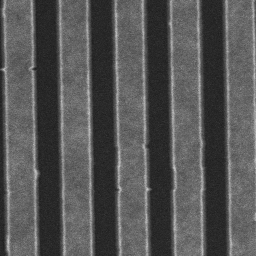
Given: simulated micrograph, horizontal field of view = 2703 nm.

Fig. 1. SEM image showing parallel lines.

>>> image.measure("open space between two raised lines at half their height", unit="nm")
263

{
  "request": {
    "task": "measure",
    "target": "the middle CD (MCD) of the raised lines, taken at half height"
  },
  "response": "323 nm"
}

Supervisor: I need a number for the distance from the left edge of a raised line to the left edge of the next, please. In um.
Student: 0.586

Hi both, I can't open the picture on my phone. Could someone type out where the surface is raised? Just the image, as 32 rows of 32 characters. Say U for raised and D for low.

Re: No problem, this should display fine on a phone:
UUUUDDDUUUUDDDUUUUDDDUUUUDDDUUUU
UUUUDDDUUUUDDDUUUUDDDUUUUDDDUUUU
UUUUDDDUUUUDDDUUUUDDDUUUUDDDUUUU
UUUUDDDUUUUDDDUUUUDDDUUUUDDDUUUU
DUUUDDDUUUUDDDUUUUDDDUUUUDDDUUUU
DUUUDDDUUUUDDDUUUUDDDUUUUDDDUUUU
DUUUDDDUUUUDDDUUUUDDDUUUUDDDUUUU
DUUUDDDUUUUDDDUUUUDDDUUUUDDDUUUU
UUUUDDDDUUUDDDUUUUDDDUUUUDDDUUUU
DUUUDDDDUUUDDDUUUUDDDUUUUDDDUUUU
DUUUDDDDUUUDDDUUUUDDDUUUUDDDUUUU
DUUUDDDDUUUDDDUUUUDDDUUUUDDDUUUU
DUUUDDDDUUUDDDDUUUDDDUUUUDDDUUUU
DUUUDDDDUUUDDDDUUUDDDUUUUDDDUUUU
DUUUDDDDUUUDDDDUUUDDDUUUUDDDUUUU
DUUUDDDDUUUDDDDUUUDDDUUUUDDDUUUU
DUUUDDDDUUUDDDDUUUDDDUUUUDDDUUUU
DUUUDDDDUUUDDDDUUUDDDDUUUDDDUUUU
DUUUDDDDUUUDDDDUUUDDDDUUUDDDUUUU
DUUUDDDDUUUDDDDUUUDDDDUUUDDDUUUU
DUUUDDDDUUUDDDDUUUDDDDUUUDDDUUUU
DUUUUDDDUUUDDDDUUUDDDDUUUDDDDUUU
DUUUUDDDUUUDDDDUUUDDDDUUUDDDDUUU
DUUUUDDDUUUDDDDUUUUDDDUUUDDDDUUU
DUUUUDDDUUUDDDDUUUDDDDUUUDDDDUUU
DUUUUDDDUUUUDDDUUUDDDDUUUDDDDUUU
DUUUUDDDUUUUDDDUUUDDDDUUUDDDDUUU
DUUUUDDDUUUUDDDUUUDDDDUUUDDDDUUU
DUUUUDDDUUUUDDDUUUDDDDUUUDDDDUUU
DUUUUDDDUUUUDDDUUUUDDDUUUDDDDUUU
DUUUUDDDUUUUDDDUUUUDDDUUUDDDDUUU
DUUUUDDDUUUUDDDUUUUDDDUUUDDDDUUU